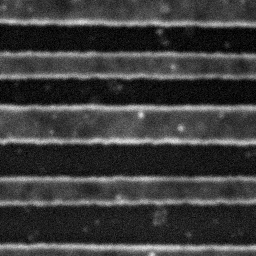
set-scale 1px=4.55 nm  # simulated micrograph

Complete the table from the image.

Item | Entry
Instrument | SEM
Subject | lines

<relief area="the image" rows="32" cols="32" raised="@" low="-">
@@@@@@@@@@@@@@@@@@@@@@@@@@@@@@@@
@@@@@@@@@@@@@@@@@@@@@@@@@@@@@@@@
@@@@@@@@@@@@@@@@@@@@@@@@@@@@@@@@
--------------------------------
--------------------------------
--------------------------------
--------------------------------
@@@@@@@@@@@@@@@@@@@@@@@@@@@@@@@@
@@@@@@@@@@@@@@@@@@@@@@@@@@@@@@@@
@@@@@@@@@@@@@@@@@@@@@@@@@@@@@@@@
--------------------------------
--------------------------------
--------------------------------
@@@@@@@@@@@@@@@@@@@@@@@@@@@@@@@@
@@@@@@@@@@@@@@@@@@@@@@@@@@@@@@@@
@@@@@@@@@@@@@@@@@@@@@@@@@@@@@@@@
@@@@@@@@@@@@@@@@@@@@@@@@@@@@@@@@
@@@@@@@@@@@@@@@@@@@@@@@@@@@@@@@@
--------------------------------
--------------------------------
--------------------------------
--------------------------------
@@@@@@@@@@@@@@@@@@@@@@@@@@@@@@@@
@@@@@@@@@@@@@@@@@@@@@@@@@@@@@@@@
@@@@@@@@@@@@@@@@@@@@@@@@@@@@@@@@
@-@-@@@------@------------------
--------------------------------
--------------------------------
--------------------------------
--------------------------------
--------------------------------
@@@@@@@@@@@@@@@@@@@@@@@@@@@@@@@@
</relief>